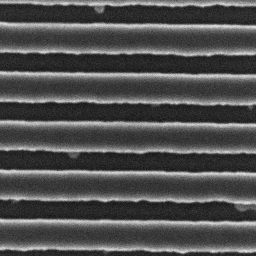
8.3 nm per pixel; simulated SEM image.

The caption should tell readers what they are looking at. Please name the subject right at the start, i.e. lines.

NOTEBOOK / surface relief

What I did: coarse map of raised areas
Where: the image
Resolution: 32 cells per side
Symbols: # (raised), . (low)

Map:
.....###########################
................................
................................
################################
################################
################################
..##.#..########################
................................
................................
#############################.##
################################
################################
################################
................................
................................
#########################.......
################################
################################
################################
................................
................................
#############...#.##............
################################
################################
################################
................................
................................
................................
################################
################################
################################
......................#.........